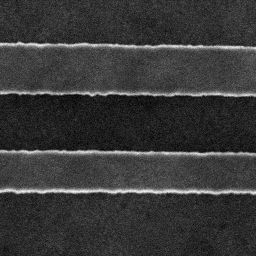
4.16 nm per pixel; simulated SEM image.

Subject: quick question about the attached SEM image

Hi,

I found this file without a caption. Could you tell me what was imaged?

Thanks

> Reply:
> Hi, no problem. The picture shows lines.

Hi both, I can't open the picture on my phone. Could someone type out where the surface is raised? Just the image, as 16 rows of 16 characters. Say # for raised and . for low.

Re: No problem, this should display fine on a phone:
................
................
................
################
################
################
................
................
................
########........
################
################
................
................
................
................